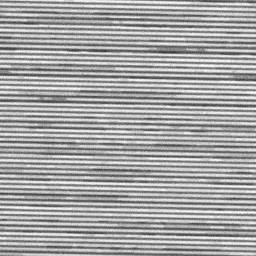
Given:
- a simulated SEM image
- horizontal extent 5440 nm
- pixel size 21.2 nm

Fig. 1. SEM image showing parallel lines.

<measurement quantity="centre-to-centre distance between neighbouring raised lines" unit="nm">111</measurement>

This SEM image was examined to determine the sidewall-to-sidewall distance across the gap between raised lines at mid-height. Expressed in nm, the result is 71.7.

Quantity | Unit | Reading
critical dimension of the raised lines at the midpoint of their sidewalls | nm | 34.5